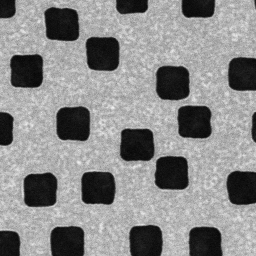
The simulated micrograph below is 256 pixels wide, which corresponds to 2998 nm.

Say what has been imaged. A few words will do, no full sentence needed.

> a regular array of holes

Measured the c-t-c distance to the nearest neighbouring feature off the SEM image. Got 588 nm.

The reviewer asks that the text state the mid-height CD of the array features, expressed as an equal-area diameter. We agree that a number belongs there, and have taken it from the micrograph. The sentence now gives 0.43 µm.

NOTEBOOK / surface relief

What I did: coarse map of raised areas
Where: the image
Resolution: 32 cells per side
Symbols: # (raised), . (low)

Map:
..############....#####....#####
..####....#####...#####....#####
######....######################
######....######################
######....######################
###########....#################
###########....#################
#....######....##############...
#....######....#####...######...
#....##############.....####....
#....###############....#####...
####################....########
#####################..#########
########...############...######
.######....###########....######
..#####....###########....#####.
..#####....####....###....#####.
..######...####....#############
###############....#############
###############....##.##########
####################...#########
###########..######.....#####...
###....###....#####.....####....
###....###.....#####...#####....
###....###....###############...
###....####...###############..#
################################
################################
#######...#######...####...#####
..####.....#####....####....####
...###.....#####....####....####
...###.....#####....####....####